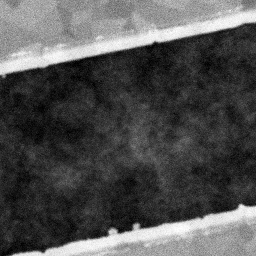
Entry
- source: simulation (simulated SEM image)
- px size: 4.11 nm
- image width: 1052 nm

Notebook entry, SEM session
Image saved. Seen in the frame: one or a few lines or trenches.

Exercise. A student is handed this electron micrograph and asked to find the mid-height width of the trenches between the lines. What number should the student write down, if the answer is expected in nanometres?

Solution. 786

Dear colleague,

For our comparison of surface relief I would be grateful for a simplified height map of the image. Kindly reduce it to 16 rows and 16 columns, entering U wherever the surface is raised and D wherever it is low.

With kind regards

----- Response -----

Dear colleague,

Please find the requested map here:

UUUUUUUUUUUUUUUU
UUUUUUUUUUUUUUDD
UUUUUUUUUDDDDDDD
UUUUDDDDDDDDDDDD
DDDDDDDDDDDDDDDD
DDDDDDDDDDDDDDDD
DDDDDDDDDDDDDDDD
DDDDDDDDDDDDDDDD
DDDDDDDDDDDDDDDD
DDDDDDDDDDDDDDDD
DDDDDDDDDDDDDDDD
DDDDDDDDDDDDDDDD
DDDDDDDDDDDDDDDD
DDDDDDDDDDDDDDDU
DDDDDDDDDDUUUUUU
DDDDDUUUUUUUUUUU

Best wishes